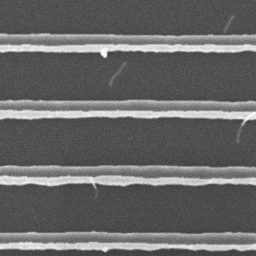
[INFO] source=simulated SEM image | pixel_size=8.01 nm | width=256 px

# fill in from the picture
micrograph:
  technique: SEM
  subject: lines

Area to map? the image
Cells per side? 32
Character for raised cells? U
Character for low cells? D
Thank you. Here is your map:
DDDDDDDDDDDDDDDDDDDDDDDDDDDDDDDD
DDDDDDDDDDDDDDDDDDDDDDDDDDDDDDDD
DDDDDDDDDDDDDDDDDDDDDDDDDDDDDDDD
DDDDDDDDDDDDDDDDDDDDDDDDDDDDDDDD
UUUUUUUUUUUUUUUUUUUUUDUUUUUUUUUU
UUUUUUUUUUUUUUUUUUUUUUUUUUUUUUUU
UDDDDDDDUUUDUUDDDDDDDDDDDUDUDUDD
DDDDDDDDDDDDDDDDDDDDDDDDDDDDDDDD
DDDDDDDDDDDDDDDDDDDDDDDDDDDDDDDD
DDDDDDDDDDDDDDDDDDDDDDDDDDDDDDDD
DDDDDDDDDDDDDDDDDDDDDDDDDDDDDDDD
DDDDDDDDDDDDDDDDDDDDDDDDDDDDDDDD
DDDDDDDDDDDDDDDDDDDDDDDDDDDDDDDD
UUUUUUUUUUUUUUUUUUUUUUUUUUUUUUUU
UUUUUUUUUUUUDUUDUUUUDUUUUUUUUUUU
DDDDDDDDDDDDDDDDDDDDDDDDDDDDDDDD
DDDDDDDDDDDDDDDDDDDDDDDDDDDDDDDD
DDDDDDDDDDDDDDDDDDDDDDDDDDDDDDDD
DDDDDDDDDDDDDDDDDDDDDDDDDDDDDDDD
DDDDDDDDDDDDDDDDDDDDDDDDDDDDDDDD
DDDDDDDDDDDDDDDDDDDDDDDDDDDDDDDD
UUUUUUUUUUUUUUUUUUUUUUUUUUUUUUUU
UUUUUUUUUUUUUUUUUUUUUUUUUUUUUUUU
DDDDDDDDDDDDDDDDDDDDDDDDDDDDDDDD
DDDDDDDDDDDDDDDDDDDDDDDDDDDDDDDD
DDDDDDDDDDDDDDDDDDDDDDDDDDDDDDDD
DDDDDDDDDDDDDDDDDDDDDDDDDDDDDDDD
DDDDDDDDDDDDDDDDDDDDDDDDDDDDDDDD
DDDDDDDDDDDDDDDDDDDDDDDDDDDDDDDD
UUUUUUUUUUUUUUUUUUUUUUUUUUUUUUUU
UUUUUUUUUUUUUUUUUUUUUUUUUUUUUUUU
DDDDDDDDDDDDDDDDDDDDDDDDDDDDDDDD